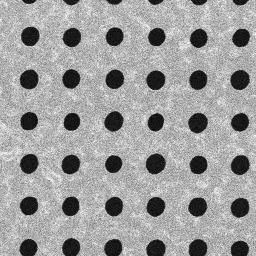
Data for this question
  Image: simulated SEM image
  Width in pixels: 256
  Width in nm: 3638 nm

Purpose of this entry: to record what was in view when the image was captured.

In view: a regular array of holes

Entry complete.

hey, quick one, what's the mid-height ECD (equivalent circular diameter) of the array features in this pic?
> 268 nanometers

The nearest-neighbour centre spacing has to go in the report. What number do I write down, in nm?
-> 593